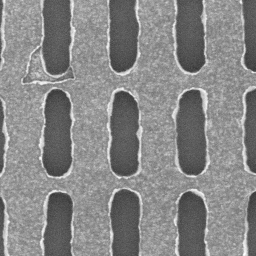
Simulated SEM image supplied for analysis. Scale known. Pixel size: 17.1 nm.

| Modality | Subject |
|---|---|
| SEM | holes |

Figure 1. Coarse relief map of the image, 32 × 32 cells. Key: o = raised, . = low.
ooooo....ooooo...ooooo...ooooo..
ooooo....ooooo...ooooo....oooo..
ooooo....ooooo...ooooo....oooo..
ooooo....ooooo...ooooo....oooo..
ooooo....ooooo...ooooo....oooo..
ooooo....ooooo...ooooo....ooooo.
ooooo....ooooo...ooooo....ooooo.
ooooo....ooooo...ooooo....oooo..
oooooo...ooooo...oooooo..oooooo.
oooooooooooooooooooooooooooooooo
oooooooooooooooooooooooooooooooo
oooooo..oooooo..ooooooo..oooooo.
oooooo...ooooo...ooooo....ooooo.
.oooo....ooooo...ooooo....ooooo.
.oooo....ooooo...ooooo....ooooo.
.ooooo...ooooo...ooooo....oooo..
.oooo....ooooo....oooo....oooo..
.oooo....ooooo...ooooo....oooo..
.oooo....ooooo...ooooo....oooo..
.oooo....ooooo...ooooo....ooooo.
ooooo....ooooo...ooooo....ooooo.
oooooo...ooooo...oooooo..oooooo.
oooooooooooooooooooooooooooooooo
oooooooooooooooooooooooooooooooo
oooooo...ooooo...oooooo..oooooo.
.ooooo...ooooo....oooo....ooooo.
.ooooo...ooooo....oooo....ooooo.
.ooooo...ooooo....oooo....ooooo.
.ooooo...ooooo...ooooo....ooooo.
.oooo....ooooo...ooooo....ooooo.
.oooo....ooooo...ooooo....ooooo.
.oooo....ooooo...ooooo....ooooo.